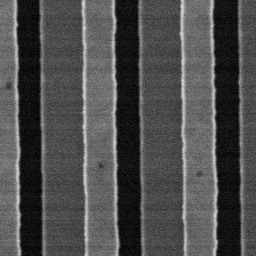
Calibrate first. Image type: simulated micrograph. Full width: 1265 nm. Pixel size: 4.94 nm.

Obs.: lines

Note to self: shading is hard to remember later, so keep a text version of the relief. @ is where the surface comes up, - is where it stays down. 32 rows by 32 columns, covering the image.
@@---@@@@@@@@@---@@@@@@@@@@---@@
@@---@@@@@@@@@---@@@@@@@@@@---@@
@@---@@@@@@@@@---@@@@@@@@@@---@@
@@---@@@@@@@@@---@@@@@@@@@@---@@
@@---@@@@@@@@@---@@@@@@@@@@---@@
@@---@@@@@@@@@----@@@@@@@@@---@@
@@---@@@@@@@@@----@@@@@@@@@---@@
@@---@@@@@@@@@---@@@@@@@@@@---@@
@@---@@@@@@@@@---@@@@@@@@@@---@@
@@---@@@@@@@@@----@@@@@@@@@---@@
@@---@@@@@@@@@----@@@@@@@@@---@@
@@---@@@@@@@@@----@@@@@@@@@---@@
@@---@@@@@@@@@----@@@@@@@@@---@@
@@---@@@@@@@@@----@@@@@@@@@---@@
@@---@@@@@@@@@----@@@@@@@@@---@@
@@---@@@@@@@@@----@@@@@@@@@---@@
@@---@@@@@@@@@----@@@@@@@@@---@@
@@---@@@@@@@@@----@@@@@@@@@---@@
@@---@@@@@@@@@----@@@@@@@@@---@@
@@---@@@@@@@@@----@@@@@@@@@---@@
@@---@@@@@@@@@@---@@@@@@@@@---@@
@@---@@@@@@@@@@---@@@@@@@@@---@@
@@---@@@@@@@@@@---@@@@@@@@@---@@
@@---@@@@@@@@@@---@@@@@@@@@---@@
@@---@@@@@@@@@@---@@@@@@@@@---@@
@@---@@@@@@@@@@---@@@@@@@@@---@@
@@---@@@@@@@@@@---@@@@@@@@@---@@
@@---@@@@@@@@@@---@@@@@@@@@---@@
@@---@@@@@@@@@@---@@@@@@@@@---@@
@@---@@@@@@@@@@---@@@@@@@@@---@@
@@---@@@@@@@@@@---@@@@@@@@@---@@
@@@--@@@@@@@@@@---@@@@@@@@@---@@